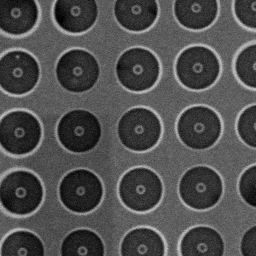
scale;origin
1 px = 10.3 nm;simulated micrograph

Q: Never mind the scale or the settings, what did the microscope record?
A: an array of small figures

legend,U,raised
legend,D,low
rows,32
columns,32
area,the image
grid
DDDDDUUDDDDDUUDDDDDDUUDDDDDUUDDD
DDDDDUUDDDDDUUDDDDDDUUDDDDDUUDDD
DDDDDUUDDDDDUUUDDDDDUUDDDDDUUUDD
DDDDUUUDDDDUUUUDDDDUUUUDDDUUUUUD
UDDUUUUUUUUUUUUUUUUUUUUUUUUUUUUU
UUUUUUUUUUUUUUUUUUUUUUUUUUUUUUUD
UDDUUUUUDDDUUUUUDDDUUUUDDDDUUUDD
DDDDDUUDDDDDUUUDDDDDUUDDDDDUUDDD
DDDDDUUDDDDDUUDDDDDDUUDDDDDDUDDD
DDDDDUUDDDDDUUUDDDDDUUDDDDDUUUDD
DDDDDUUUDDDDUUUDDDDUUUUDDDDUUUDD
UDDDUUUUUDUUUUUUUDUUUUUUUUUUUUUU
UUUUUUUUUUUUUUUUUUUUUUUUUUUUUUUU
UUUUUUUUUUUUUUUUUDUUUUUDDDUUUUUD
DDDDUUUUDDDDUUUDDDDDUUDDDDDUUUDD
DDDDDUUDDDDDUUUDDDDDUUDDDDDDUUDD
DDDDDUUDDDDDDUUDDDDDUUDDDDDDUUDD
DDDDDUUDDDDDUUUDDDDDUUUDDDDUUUDD
DDDDDUUUDDDDUUUUDDDUUUUUDDUUUUUU
UUDUUUUUUUUUUUUUUUUUUUUUUUUUUUUU
UUUUUUUUUUUUUUUUUUUUUUUUUUUUUUUU
UDDDUUUUUDDDUUUUDDDUUUUDDDDUUUDD
DDDDDUUUDDDDDUUDDDDDUUUDDDDDUUDD
DDDDDUUDDDDDDUUDDDDDUUDDDDDDUUDD
DDDDDUUDDDDDDUUDDDDDUUDDDDDDUUDD
DDDDDUUUDDDDUUUDDDDDUUUDDDDUUUUD
UDDDUUUUUDDUUUUUUDUUUUUUUUUUUUUU
UUUUUUUUUUUUUUUUUUUUUUUUUUUUUUUU
UUUUUUUUUUUUUUUUUDDUUUUUDDUUUUUD
UDDDDUUUDDDDUUUUDDDDUUUDDDDDUUDD
DDDDDUUUDDDDDUUDDDDDDUDDDDDDUUDD
DDDDDDUUDDDDDUUDDDDDDUDDDDDDUUDD